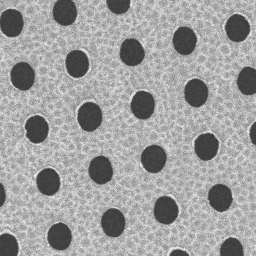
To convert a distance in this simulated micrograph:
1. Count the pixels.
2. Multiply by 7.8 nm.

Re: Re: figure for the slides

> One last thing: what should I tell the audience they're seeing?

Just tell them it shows a regular array of holes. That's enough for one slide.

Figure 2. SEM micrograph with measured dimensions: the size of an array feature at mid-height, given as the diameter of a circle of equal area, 0.207 um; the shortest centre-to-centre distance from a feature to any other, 419 nm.